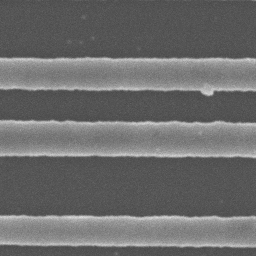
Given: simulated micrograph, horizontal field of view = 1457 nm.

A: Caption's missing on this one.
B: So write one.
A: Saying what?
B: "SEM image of lines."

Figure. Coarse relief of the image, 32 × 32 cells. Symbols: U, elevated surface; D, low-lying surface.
DDDDDDDDDDDDDDDDDDDDDDDDDDDDDDDD
DDDDDDDDDDDDDDDDDDDDDDDDDDDDDDDD
DDDDDDDDDDDDDDDDDDDDDDDDDDDDDDDD
DDDDDDDDDDDDDDDDDDDDDDDDDDDDDDDD
DDDDDDDDDDDDDDDDDDDDDDDDDDDDDDDD
DDDDDDDDDDDDDDDDDDDDDDDDDDDDDDDD
DDDDDDDDDDDDDDDDDDDDDDDDDDDDDDDD
UUUUUUUUUUUUUUUUUUUUUUUUUUUUUUUU
UUUUUUUUUUUUUUUUUUUUUUUUUUUUUUUU
UUUUUUUUUUUUUUUUUUUUUUUUUUUUUUUU
UUUUUUUUUUUUUUUUUUUUUUUUUUUUUUUU
DDDDDDDDDDDDDDDDDDDDDDDDDUUDDDDD
DDDDDDDDDDDDDDDDDDDDDDDDDDDDDDDD
DDDDDDDDDDDDDDDDDDDDDDDDDDDDDDDD
DDDDDDDDDDDDDDDDDDDDDDDDDDDDDDDD
UUUUUUUUUUUUUUUUUUUUUUUUUUUUUUUU
UUUUUUUUUUUUUUUUUUUUUUUUUUUUUUUU
UUUUUUUUUUUUUUUUUUUUUUUUUUUUUUUU
UUUUUUUUUUUUUUUUUUUUUUUUUUUUUUUU
DDDDDDDDDDDDDDUDDDDUUUUDDUUUUUUU
DDDDDDDDDDDDDDDDDDDDDDDDDDDDDDDD
DDDDDDDDDDDDDDDDDDDDDDDDDDDDDDDD
DDDDDDDDDDDDDDDDDDDDDDDDDDDDDDDD
DDDDDDDDDDDDDDDDDDDDDDDDDDDDDDDD
DDDDDDDDDDDDDDDDDDDDDDDDDDDDDDDD
DDDDDDDDDDDDDDDDDDDDDDDDDDDDDDDD
DDDDDDDDDDDDDDDDDDDDDDDDDDDDDDDD
UUUUUUUUUUUUUUUUUUUUUUUUUUUUUUUU
UUUUUUUUUUUUUUUUUUUUUUUUUUUUUUUU
UUUUUUUUUUUUUUUUUUUUUUUUUUUUUUUU
UUUUUUUUUUUUUUUUUUUUUUUUUUUUUUUU
DDDDDDDDDDDDDDDDDDDDDDDDDDDDDDDD